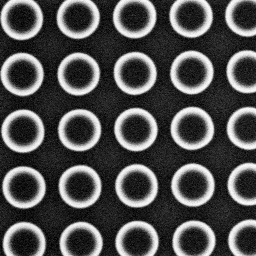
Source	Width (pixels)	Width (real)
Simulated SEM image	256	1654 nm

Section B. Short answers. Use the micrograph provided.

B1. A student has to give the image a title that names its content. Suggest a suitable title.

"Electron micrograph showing an array of small figures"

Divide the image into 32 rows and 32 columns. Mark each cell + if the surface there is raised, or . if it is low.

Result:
.++++...++++...++++...++++...+++
+++++..+++++..+++++..+++++..++++
+++++..+++++..+++++..+++++..++++
+++++..+++++...++++...++++...+++
.+++.....++.....++.....++.......
................................
.......................++.....++
.++++...++++...++++...++++...+++
+++++..+++++..+++++..++++++.++++
+++++..+++++..+++++..++++++.++++
+++++...++++...++++...++++...+++
.+++.....++.....++.....++.......
................................
................................
.++++...++++...++++...++++...+++
+++++..+++++..+++++...+++++.++++
+++++..++++++.++++++.++++++.++++
+++++...++++...++++...++++...+++
.+++.....++.....++.....++.....++
................................
..............................++
.++++...++++...++++...++++...+++
.++++..+++++...++++...+++++..+++
++++++..+++++..+++++..+++++..+++
.++++...++++...++++...++++...+++
.+++.....++.....++.....++.....++
................................
................................
.++++...++++...++++...++++...+++
.++++...+++++..+++++..+++++..+++
++++++..+++++..+++++..+++++..+++
.++++...++++...++++...++++...+++